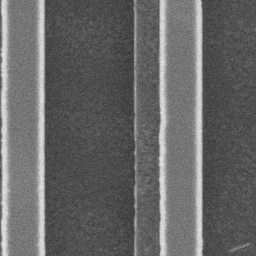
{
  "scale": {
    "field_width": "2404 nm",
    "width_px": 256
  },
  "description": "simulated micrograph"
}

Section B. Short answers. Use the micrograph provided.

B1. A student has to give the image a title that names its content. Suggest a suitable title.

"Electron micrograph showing lines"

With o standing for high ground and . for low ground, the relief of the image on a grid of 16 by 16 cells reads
ooo......oooo...
ooo.....ooooo...
ooo.....ooooo...
ooo.....o.ooo...
ooo.....ooooo...
ooo.....ooooo...
ooo.....ooooo...
ooo.....ooooo...
ooo.....ooooo...
ooo.....ooooo...
ooo......oooo...
ooo......oooo...
ooo......oooo...
ooo......oooo...
ooo.....ooooo...
ooo.....ooooo...